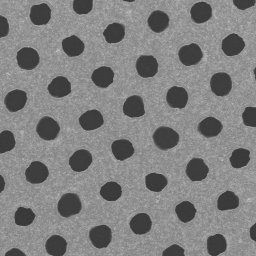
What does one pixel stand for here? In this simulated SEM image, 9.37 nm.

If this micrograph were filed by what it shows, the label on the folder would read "a regular array of holes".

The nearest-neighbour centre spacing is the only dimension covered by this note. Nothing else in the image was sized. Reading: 402 nanometres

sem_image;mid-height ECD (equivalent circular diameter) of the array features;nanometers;204